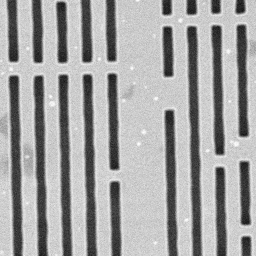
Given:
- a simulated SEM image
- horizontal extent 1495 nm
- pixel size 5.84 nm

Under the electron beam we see groups of lines, slits or small figures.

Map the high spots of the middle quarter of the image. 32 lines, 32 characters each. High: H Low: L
HHHHHHHHHHHHHHHHHHHHHHHHHLLLHHHL
HHHHHHHHHHHHHHHHHHHHHHHHHLLLHHHL
LHHHHLLHHHHLLHHHHHHHHHHHHLLLHHHL
LHHHLLLHHHHLLLHHHHHHHHHHHHHHHHHL
LHHHLLLHHHHLLLHHHHHHHHHHHHHHHHHL
LHHHHLLHHHHLLLHHHHHHHHHHHHHHHHHL
LHHHHLLHHHHLLLHHHHHHHHHHHHHHHHHL
LHHHHLLHHHHLLLHHHHHHHHHHHHHHHHHL
LHHHHLLHHHHLLLHHHHHHHHHHHHHHHHHL
LHHHHLLHHHHLLLHHHHHHHHHHHHHHHHHL
LHHHHLLHHHHLLLHHHHHHHHHHHHHHHHHL
LHHHHLLLHHHLLLHHHHHHHHHHHHLHHHHL
LHHHHLLLHHHLLLHHHHHHHHHHHLLLHHHL
LHHHHLLLHHHLLLHHHHHHHHHHHLLLHHHL
LHHHHLLLHHHLLLHHHHHHHHHHHLLLHHHL
LHHHHLLLHHHLLLHHHHHHHHHHHLLLHHHL
LHHHHLLLHHHLLLHHHHHHHHHHHLLLHHHL
LHHHHLLLHHHLLLHHHHHHHHHHHLLLHHHL
LLHHHLLLHHHLLLHHHHHHHHHHHLLLHHHL
LLHHHLLLHHHLLLHHHHHHHHHHHLLLHHHL
LLHHHLLLHHHLLLHHHHHHHHHHHLLLHHHL
LLHHHLLLHHHLLLHHHHHHHHHHHLLLHHHL
LLHHHLLLHHHLLLHHHHHHHHHHHLLLHHHL
LLHHHLLLHHHLLLHHHHHHHHHHHLLLHHHL
LLHHHLLLHHHLLLHHHHHHHHHHHLLLHHHL
LLHHHLLLHHHLLLHHHHHHHHHHHLLLHHHL
LLHHHLLLHHHHLHHHHHHHHHHHHLLLHHHH
LLHHHLLLHHHHHHHHHHHHHHHHHLLLHHHH
LLHHHLLLHHHHHHHHHHHHHHHHHLLLHHHH
LLHHHLLLHHHHLLHHHHHHHHHHHLLLHHHH
LLHHHLLLHHHLLLHHHHHHHHHHHLLLHHHH
LLHHHLLLHHHLLLHHHHHHHHHHHLLLHHHH